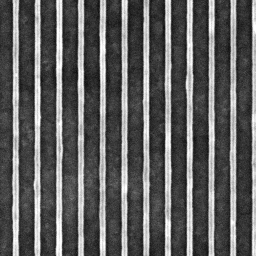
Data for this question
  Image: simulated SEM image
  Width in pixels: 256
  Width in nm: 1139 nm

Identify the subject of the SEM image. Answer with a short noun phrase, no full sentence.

parallel lines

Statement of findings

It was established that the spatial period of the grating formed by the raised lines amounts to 21.7 pixels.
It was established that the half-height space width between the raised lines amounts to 0.0789 µm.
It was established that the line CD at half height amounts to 17.8 nm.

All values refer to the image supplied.